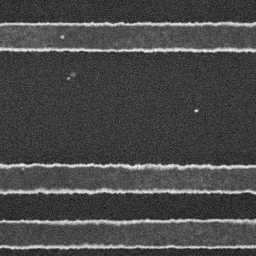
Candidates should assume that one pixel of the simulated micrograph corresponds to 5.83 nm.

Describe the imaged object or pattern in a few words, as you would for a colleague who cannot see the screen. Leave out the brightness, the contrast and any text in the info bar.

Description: lines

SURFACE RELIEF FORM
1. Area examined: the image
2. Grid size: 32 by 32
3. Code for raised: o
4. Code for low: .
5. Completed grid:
................................
................................
................................
oooooooooooooooooooooooooooooooo
oooooooooooooooooooooooooooooooo
oooooooooooooooooooooooooooooooo
................................
................................
................................
................................
................................
................................
................................
................................
................................
................................
................................
................................
................................
................................
................................
oooooooooooooooooooooooooooooooo
oooooooooooooooooooooooooooooooo
oooooooooooooooooooooooooooooooo
................................
................................
................................
......................oo..o.o...
oooooooooooooooooooooooooooooooo
oooooooooooooooooooooooooooooooo
oooooooooooooooooooooooooooooooo
................................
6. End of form